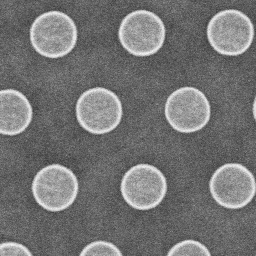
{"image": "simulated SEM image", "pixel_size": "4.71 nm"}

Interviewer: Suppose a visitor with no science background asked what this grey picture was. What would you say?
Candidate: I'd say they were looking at a regular array of raised bodies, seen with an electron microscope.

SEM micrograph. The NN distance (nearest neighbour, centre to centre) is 88.3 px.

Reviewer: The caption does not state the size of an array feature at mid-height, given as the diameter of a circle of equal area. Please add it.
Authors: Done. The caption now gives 212 nm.